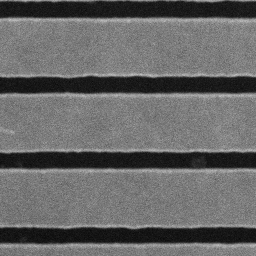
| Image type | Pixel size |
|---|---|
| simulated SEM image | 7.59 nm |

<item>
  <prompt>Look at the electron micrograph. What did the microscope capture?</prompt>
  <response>lines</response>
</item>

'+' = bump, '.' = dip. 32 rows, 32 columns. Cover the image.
................................
................................
++++++++++++++++++++++++++++++++
++++++++++++++++++++++++++++++++
++++++++++++++++++++++++++++++++
++++++++++++++++++++++++++++++++
++++++++++++++++++++++++++++++++
++++++++++++++++++++++++++++++++
++++++++++++++++++++++++++++++++
+++++++++++.++++++++++++++++++++
................................
................................
++++++++++++++++++++++++++++++++
++++++++++++++++++++++++++++++++
++++++++++++++++++++++++++++++++
++++++++++++++++++++++++++++++++
++++++++++++++++++++++++++++++++
++++++++++++++++++++++++++++++++
++++++++++++++++++++++++++++++++
................................
................................
++++++++++++++++++++++++++++++++
++++++++++++++++++++++++++++++++
++++++++++++++++++++++++++++++++
++++++++++++++++++++++++++++++++
++++++++++++++++++++++++++++++++
++++++++++++++++++++++++++++++++
++++++++++++++++++++++++++++++++
.......++.......++..............
................................
+++++..+++++++++++++++++++++.+++
++++++++++++++++++++++++++++++++